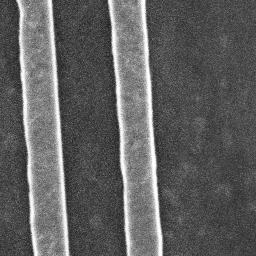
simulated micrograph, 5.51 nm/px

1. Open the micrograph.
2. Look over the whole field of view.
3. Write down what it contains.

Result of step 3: one or a few lines or trenches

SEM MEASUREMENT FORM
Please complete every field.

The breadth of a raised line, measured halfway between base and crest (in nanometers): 178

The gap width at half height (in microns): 0.337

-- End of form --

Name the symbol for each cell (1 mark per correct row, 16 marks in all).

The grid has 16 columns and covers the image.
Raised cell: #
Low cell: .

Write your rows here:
.##....##.......
.##....##.......
.##....##.......
.##....##.......
.##....##.......
.###...##.......
..##...##.......
..##....#.......
..##....##......
..##....##......
..##....##......
..##....##......
..##....##......
..##....##......
..##....##......
..##....##......